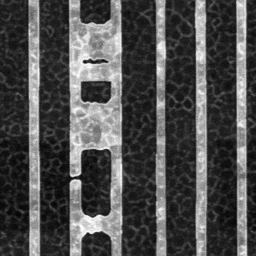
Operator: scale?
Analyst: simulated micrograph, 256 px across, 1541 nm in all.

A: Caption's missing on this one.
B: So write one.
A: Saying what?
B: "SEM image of parallel lines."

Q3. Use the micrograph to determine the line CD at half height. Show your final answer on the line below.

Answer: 51.1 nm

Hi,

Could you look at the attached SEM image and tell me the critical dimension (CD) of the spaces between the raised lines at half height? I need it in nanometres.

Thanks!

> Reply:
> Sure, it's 188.